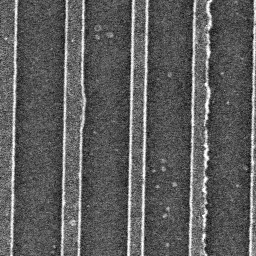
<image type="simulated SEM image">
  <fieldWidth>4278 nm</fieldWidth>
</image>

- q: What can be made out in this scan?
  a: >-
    one or a few lines or trenches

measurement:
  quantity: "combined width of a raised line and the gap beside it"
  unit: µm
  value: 1.06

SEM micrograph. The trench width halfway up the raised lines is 796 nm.